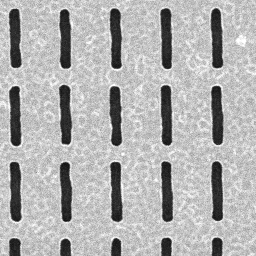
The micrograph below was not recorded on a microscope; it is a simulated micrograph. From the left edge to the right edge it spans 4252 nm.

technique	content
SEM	a regular array of holes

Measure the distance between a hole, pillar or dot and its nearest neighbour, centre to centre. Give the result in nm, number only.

829